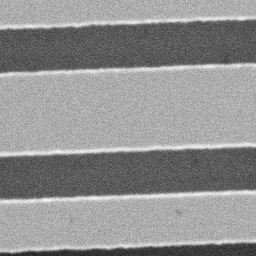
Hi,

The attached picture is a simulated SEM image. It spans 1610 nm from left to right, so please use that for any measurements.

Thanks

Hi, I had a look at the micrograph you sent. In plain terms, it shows lines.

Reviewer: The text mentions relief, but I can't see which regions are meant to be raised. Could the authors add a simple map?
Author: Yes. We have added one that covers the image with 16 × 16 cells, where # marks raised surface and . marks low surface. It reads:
################
######..........
................
................
...#############
################
################
################
################
######..........
................
................
..##############
################
################
#######.........